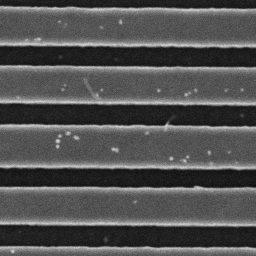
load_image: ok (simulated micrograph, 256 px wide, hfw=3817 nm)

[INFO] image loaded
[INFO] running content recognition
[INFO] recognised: lines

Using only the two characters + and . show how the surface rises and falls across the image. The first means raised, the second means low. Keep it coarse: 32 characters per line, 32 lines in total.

................................
++++++++++++++++++++++++++++++++
++++++++++++++++++++++++++++++++
++++++++++++++++++++++++++++++++
++++++++++++++++++++++++++++++++
++++++++++++++++++++++++++++++++
................................
................................
++++++++++++++++++++++++++++++++
++++++++++++++++++++++++++++++++
++++++++++++++++++++++++++++++++
++++++++++++++++++++++++++++++++
++++++++++++++++++++++++++++++++
................................
................................
................................
++++++++++++++++++++++++++++++++
++++++++++++++++++++++++++++++++
++++++++++++++++++++++++++++++++
++++++++++++++++++++++++++++++++
++++++++++++++++++++++++++++++++
................................
................................
+++++++++++++++...+...+.++....++
++++++++++++++++++++++++++++++++
++++++++++++++++++++++++++++++++
++++++++++++++++++++++++++++++++
++++++++++++++++++++++++++++++++
................................
................................
................................
++++++++++++++++++++++++++++++++